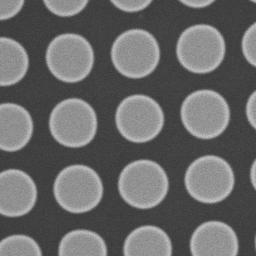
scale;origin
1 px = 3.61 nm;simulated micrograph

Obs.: an array of small figures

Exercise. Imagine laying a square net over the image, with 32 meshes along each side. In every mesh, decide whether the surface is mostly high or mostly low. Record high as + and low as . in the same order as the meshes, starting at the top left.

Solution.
+++...+++++...+++++....+++......
++.....+++......................
................................
........................+++....+
.......+++.....++++....+++++..++
++....+++++...++++++..++++++..++
+++...++++++..++++++..++++++..++
++++..++++++..++++++..++++++...+
+++...+++++...+++++....++++.....
+++....++++.....++..............
++..............................
........................+++.....
........++.....++++....+++++...+
+++....+++++...+++++...++++++..+
++++..++++++..++++++...++++++..+
++++..++++++...+++++...+++++...+
++++..++++++...+++++....++++....
++++...++++.....+++.............
+++.............................
..........................+.....
................++++....++++....
+++.....++++...++++++..++++++..+
++++...++++++..++++++..++++++..+
+++++..++++++..++++++..++++++...
+++++..++++++..++++++...++++....
++++...+++++....++++............
++++.....+......................
................................
.................+++.....++++...
.++.....++++....+++++...+++++...
+++++..++++++...+++++...++++++..
+++++..++++++..++++++...++++++..